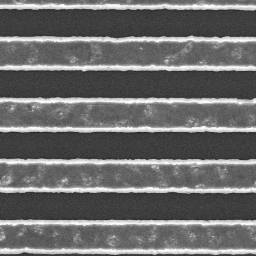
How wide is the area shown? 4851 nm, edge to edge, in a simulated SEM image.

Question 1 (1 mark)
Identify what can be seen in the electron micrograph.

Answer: parallel lines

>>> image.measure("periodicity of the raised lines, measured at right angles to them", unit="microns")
1.16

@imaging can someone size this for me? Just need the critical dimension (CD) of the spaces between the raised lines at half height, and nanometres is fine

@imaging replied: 580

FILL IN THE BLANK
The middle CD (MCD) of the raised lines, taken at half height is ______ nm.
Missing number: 580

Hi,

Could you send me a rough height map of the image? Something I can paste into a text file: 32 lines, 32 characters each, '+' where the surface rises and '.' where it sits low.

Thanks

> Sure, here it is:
++++++++++++++++++++++++++++++++
................................
................................
................................
................................
++++++++++++++++++++++++++++++++
++++++++++++++++++++++++++++++++
++++++++++++++++++++++++++++++++
++++++++++++++++++++++++++++++++
................................
................................
................................
+++++++++++++++.+++++++.........
++++++++++++++++++++++++++++++++
++++++++++++++++++++++++++++++++
++++++++++++++++++++++++++++++++
................................
................................
................................
................................
++++++++++++++++++++++++++++++++
++++++++++++++++++++++++++++++++
++++++++++++++++++++++++++++++++
++++++++++++++++++++++++++++++++
................................
................................
................................
................................
++++++++++++++++++++++++++++++++
++++++++++++++++++++++++++++++++
++++++++++++++++++++++++++++++++
.........+++++++++++++++++++++++